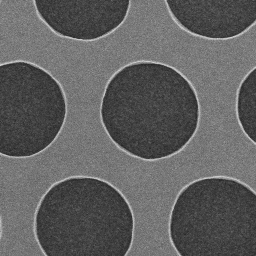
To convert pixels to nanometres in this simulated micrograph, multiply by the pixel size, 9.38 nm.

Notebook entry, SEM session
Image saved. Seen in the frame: holes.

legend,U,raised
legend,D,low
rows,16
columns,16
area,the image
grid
UUDDDDDDUUUDDDDD
UUUDDDDUUUUDDDDD
UUUUUUUUUUUUUUUU
UUUUUUUUUUUUUUUU
DDDUUUUDDDDUUUUU
DDDDUUUDDDDDUUUD
DDDDUUDDDDDDUUUD
DDDDUUDDDDDDUUUD
DDDUUUUDDDDDUUUU
DDUUUUUUDDDUUUUU
UUUUUUUUUUUUUUUU
UUUUDDDUUUUUDDDU
UUUDDDDDUUUDDDDD
UUDDDDDDUUUDDDDD
UUDDDDDDUUUDDDDD
UUUDDDDDUUUDDDDD